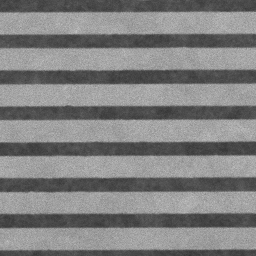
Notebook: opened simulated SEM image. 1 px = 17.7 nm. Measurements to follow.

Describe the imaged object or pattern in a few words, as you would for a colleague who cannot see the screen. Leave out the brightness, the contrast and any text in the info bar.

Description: parallel lines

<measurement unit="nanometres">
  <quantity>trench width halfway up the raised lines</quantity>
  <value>259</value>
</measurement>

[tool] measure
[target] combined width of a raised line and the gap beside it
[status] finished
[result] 0.636 µm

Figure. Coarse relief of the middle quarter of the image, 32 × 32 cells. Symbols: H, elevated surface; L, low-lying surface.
HHHHHHHHHHHHHHHHHHHHHHHHHHHHHHHH
LLHLLLLLLLLLLLLLLLLLLLLLLLLLLLLL
LLLLLLLLLLLLLLLLLLLLLLLLLLLLLLLL
LLLLLLLLLLLLLLLLLLLLLLLLLLLLLLLL
LLLLLLLLLLLLLLLLLLLLLLLLLLLLLLLL
HHHHHHHHHHHHHHHHHHHHHHHHHHHHHHHH
HHHHHHHHHHHHHHHHHHHHHHHHHHHHHHHH
HHHHHHHHHHHHHHHHHHHHHHHHHHHHHHHH
HHHHHHHHHHHHHHHHHHHHHHHHHHHHHHHH
HHHHHHHHHHHHHHHHHHHHHHHHHHHHHHHH
LLLLLLLLLLLLLLLLLLLLLLLLLLLLLLLL
LLLLLLLLLLLLLLLLLLLLLLLLLLLLLLLL
LLLLLLLLLLLLLLLLLLLLLLLLLLLLLLLL
LLLLLLLLLLLLLLLLLLLLLLLLLLLLLLLL
HHHHHHHHHHHHHHHHHHHHHHHHHHHHHHHH
HHHHHHHHHHHHHHHHHHHHHHHHHHHHHHHH
HHHHHHHHHHHHHHHHHHHHHHHHHHHHHHHH
HHHHHHHHHHHHHHHHHHHHHHHHHHHHHHHH
HHHHHHHHHHHHHHHHHHHHHHHHHHHHHHHH
LLLLLLLLLLLLLLLLLLLLLLLLLLLLLLLL
LLLLLLLLLLLLLLLLLLLLLLLLLLLLLLLL
LLLLLLLLLLLLLLLLLLLLLLLLLLLLLLLL
LLLLLLLLLLLLLLLLLLLLLLLLLLLLLLLL
HHHHHHHHHHHHHHHHHHHHHHHHHHHHHHHH
HHHHHHHHHHHHHHHHHHHHHHHHHHHHHHHH
HHHHHHHHHHHHHHHHHHHHHHHHHHHHHHHH
HHHHHHHHHHHHHHHHHHHHHHHHHHHHHHHH
HHHHHHHHHHHHHHHHHHHHHHHHHHHHHHHH
LLLLLLLLLLLLLLLLLLLLLLLLLLLLLLLL
LLLLLLLLLLLLLLLLLLLLLLLLLLLLLLLL
LLLLLLLLLLLLLLLLLLLLLLLLLLLLLLLL
LLLLLLLLLLLLLLLLLLLLLLLLLLLLLLLL